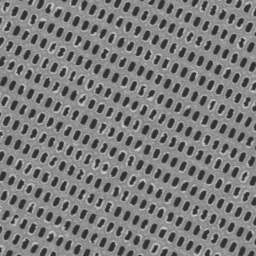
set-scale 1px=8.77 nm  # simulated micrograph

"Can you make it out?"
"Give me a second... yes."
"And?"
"a regular array of holes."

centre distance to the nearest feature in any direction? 86 nm